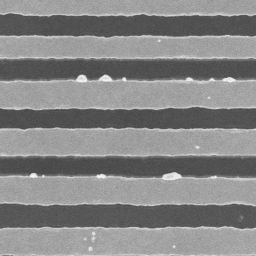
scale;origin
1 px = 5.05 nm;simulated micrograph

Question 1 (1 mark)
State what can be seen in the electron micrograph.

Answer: lines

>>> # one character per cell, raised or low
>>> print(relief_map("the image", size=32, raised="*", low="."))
********************************
********************************
................................
................................
....*.............*.........*...
********************************
********************************
................................
................................
.............*..................
********************************
********************************
********************************
*********.*.*********.....***...
................................
................................
********************************
********************************
********************************
................................
................................
................................
********************************
********************************
********************************
...*******......****..*.**.*..**
................................
................................
.....**.*****...**..*********...
********************************
********************************
********************************